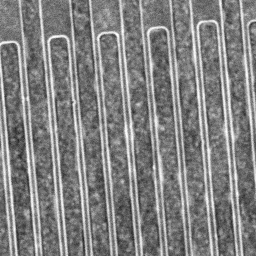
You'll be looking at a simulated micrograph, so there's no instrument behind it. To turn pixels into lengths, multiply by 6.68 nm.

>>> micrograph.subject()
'parallel lines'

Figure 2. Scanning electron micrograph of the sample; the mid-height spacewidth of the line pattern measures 129 nm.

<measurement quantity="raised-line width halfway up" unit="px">6.09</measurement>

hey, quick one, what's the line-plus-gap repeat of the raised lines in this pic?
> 0.167 microns